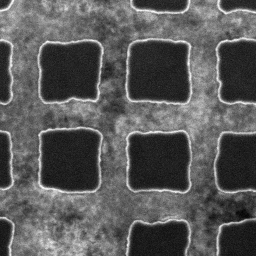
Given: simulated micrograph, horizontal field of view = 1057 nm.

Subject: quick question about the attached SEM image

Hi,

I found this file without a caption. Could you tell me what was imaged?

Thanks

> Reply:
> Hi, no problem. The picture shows raised bodies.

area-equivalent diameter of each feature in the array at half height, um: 0.286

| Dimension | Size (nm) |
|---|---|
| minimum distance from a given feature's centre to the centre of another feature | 366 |